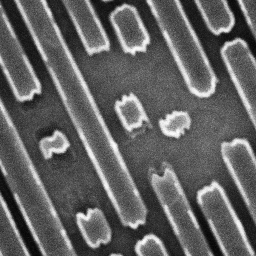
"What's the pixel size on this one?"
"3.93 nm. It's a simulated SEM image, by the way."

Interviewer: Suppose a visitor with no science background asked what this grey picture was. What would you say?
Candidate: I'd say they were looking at parallel lines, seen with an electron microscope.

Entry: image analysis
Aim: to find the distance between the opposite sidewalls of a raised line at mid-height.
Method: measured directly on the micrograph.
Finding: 0.104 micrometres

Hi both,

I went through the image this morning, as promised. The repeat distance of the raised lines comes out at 162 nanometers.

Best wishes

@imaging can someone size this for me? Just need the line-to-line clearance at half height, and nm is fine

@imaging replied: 57.5